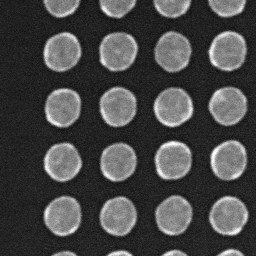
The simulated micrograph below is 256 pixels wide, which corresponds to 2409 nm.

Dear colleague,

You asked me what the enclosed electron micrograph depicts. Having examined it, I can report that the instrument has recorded a regular array of raised bodies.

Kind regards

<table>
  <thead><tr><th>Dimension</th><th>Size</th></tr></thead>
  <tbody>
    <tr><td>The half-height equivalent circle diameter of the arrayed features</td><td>344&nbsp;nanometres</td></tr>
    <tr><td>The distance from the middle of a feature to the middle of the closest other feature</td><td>513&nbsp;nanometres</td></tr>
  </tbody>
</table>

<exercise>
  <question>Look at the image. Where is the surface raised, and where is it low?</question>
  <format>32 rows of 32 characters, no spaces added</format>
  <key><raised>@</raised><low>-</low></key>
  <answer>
------@@@@---@@@@--@@@@@--@@@@--
------@@@----@@@----@@@----@@@--
--------------------------------
--------------------------------
-------@@-----@@----@@@-----@@--
------@@@@---@@@@---@@@@---@@@@-
------@@@@---@@@@--@@@@@--@@@@@-
------@@@@---@@@@---@@@@--@@@@--
------@@@-----@@----@@@----@@---
--------------------------------
--------------------------------
-------@@-----@@----@@@----@@@--
------@@@@---@@@@---@@@@--@@@@@-
------@@@@---@@@@--@@@@@--@@@@@-
------@@@@---@@@@---@@@@---@@@--
-------@@-----@@-----@------@---
--------------------------------
--------------------------------
-------@@-----@@----@@@----@@@--
------@@@@---@@@@---@@@@---@@@@-
------@@@@---@@@@---@@@@--@@@@@-
------@@@@---@@@@---@@@----@@@--
--------------@-----------------
--------------------------------
--------------------------------
------@@@@---@@@----@@@@---@@@--
------@@@@---@@@@---@@@@--@@@@@-
------@@@@---@@@@---@@@@--@@@@@-
------@@@@---@@@----@@@----@@@--
--------------------------------
--------------------------------
--------@------------@@-----@@--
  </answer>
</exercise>